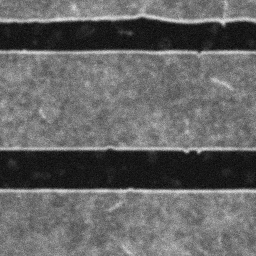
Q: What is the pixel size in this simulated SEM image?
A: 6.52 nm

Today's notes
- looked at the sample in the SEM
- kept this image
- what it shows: one or a few lines or trenches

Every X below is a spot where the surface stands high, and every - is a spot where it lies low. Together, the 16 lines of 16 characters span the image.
XXXXXXXXXXXXXXXX
----------------
----------------
XXXXXXXXXXXXXXXX
XXXXXXXXXXXXXXXX
XXXXXXXXXXXXXXXX
XXXXXXXXXXXXXXXX
XXXXXXXXXXXXXXXX
XXXXXXXXXXXXXXXX
----------------
----------------
----------------
XXXXXXXXXXXXXXXX
XXXXXXXXXXXXXXXX
XXXXXXXXXXXXXXXX
XXXXXXXXXXXXXXXX